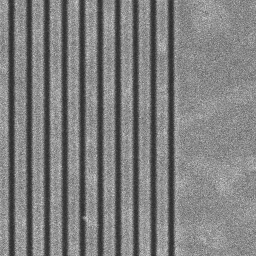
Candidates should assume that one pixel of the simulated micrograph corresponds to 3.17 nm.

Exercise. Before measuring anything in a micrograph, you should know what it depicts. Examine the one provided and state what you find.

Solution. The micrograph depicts parallel lines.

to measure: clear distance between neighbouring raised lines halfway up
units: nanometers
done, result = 18.6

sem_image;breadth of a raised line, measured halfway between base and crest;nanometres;37.7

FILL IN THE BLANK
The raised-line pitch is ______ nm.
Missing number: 56.2